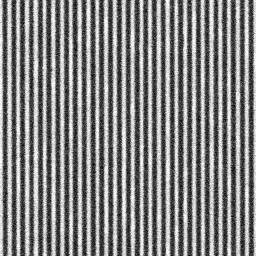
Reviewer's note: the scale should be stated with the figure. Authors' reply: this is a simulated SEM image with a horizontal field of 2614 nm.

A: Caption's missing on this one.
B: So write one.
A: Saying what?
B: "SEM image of parallel lines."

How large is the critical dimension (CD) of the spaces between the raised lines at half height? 0.0574 µm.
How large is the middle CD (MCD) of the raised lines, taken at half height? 29.4 nanometers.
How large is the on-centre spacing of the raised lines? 89.8 nanometers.